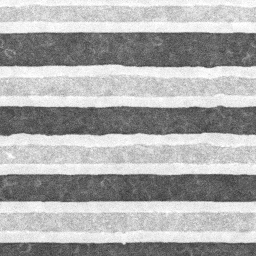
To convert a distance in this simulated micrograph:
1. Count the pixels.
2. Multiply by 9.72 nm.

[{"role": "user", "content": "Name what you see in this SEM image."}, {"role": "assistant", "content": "one or a few lines or trenches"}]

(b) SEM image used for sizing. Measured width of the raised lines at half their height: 302 nm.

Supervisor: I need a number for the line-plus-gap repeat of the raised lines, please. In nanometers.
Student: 658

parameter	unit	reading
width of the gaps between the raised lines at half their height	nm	362